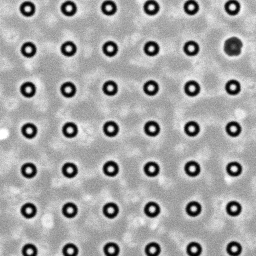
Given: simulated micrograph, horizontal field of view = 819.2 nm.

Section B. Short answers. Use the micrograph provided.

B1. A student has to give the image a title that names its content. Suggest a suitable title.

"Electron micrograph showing a regular array of ring-shaped grooves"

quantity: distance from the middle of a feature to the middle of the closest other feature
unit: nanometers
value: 127